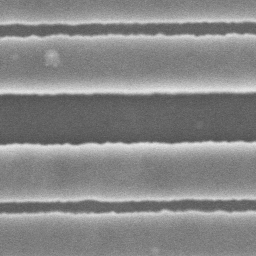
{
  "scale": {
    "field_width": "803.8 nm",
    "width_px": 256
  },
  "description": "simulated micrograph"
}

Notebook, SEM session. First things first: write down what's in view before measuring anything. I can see lines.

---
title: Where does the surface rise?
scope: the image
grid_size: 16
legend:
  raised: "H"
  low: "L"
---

HHHHHHHHHHHHHHHH
HHHHHHHHHHHHHHHH
HHHHHHHHHHHHHHHH
HHHHHHHHHHHHHHHH
HHHHHHHHHHHHHHHH
HHHHHHHHHHHHHHHH
LLLLLLLLLLLLLLLL
LLLLLLLLLLLLLLLL
LLLLLLLLLLLLLLLL
HHHHHHHHHHHHHHHH
HHHHHHHHHHHHHHHH
HHHHHHHHHHHHHHHH
HHHHHHHHHHHHHHHH
HHHHHHHHHHHHHHHH
HHHHHHHHHHHHHHHH
HHHHHHHHHHHHHHHH